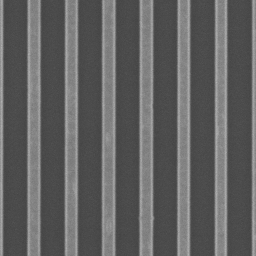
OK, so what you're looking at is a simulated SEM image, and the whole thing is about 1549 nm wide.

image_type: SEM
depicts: parallel lines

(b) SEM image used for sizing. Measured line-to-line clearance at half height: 160 nanometres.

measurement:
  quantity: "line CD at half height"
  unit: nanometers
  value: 68.9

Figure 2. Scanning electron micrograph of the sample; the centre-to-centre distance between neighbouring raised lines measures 226 nm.